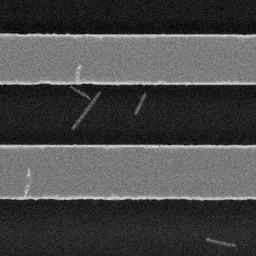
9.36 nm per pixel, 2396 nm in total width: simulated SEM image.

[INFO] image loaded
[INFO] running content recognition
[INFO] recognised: lines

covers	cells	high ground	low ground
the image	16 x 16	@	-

----------------
----------------
@@@@@@@@@@@@@@@@
@@@@@@@@@@@@@@@@
@@@@@@@@@@@@@@@@
----------------
----------------
----------------
----------------
@@@@@@@@@@@@@@@@
@@@@@@@@@@@@@@@@
@@@@@@@@@@@@@@@@
----------------
----------------
----------------
----------------